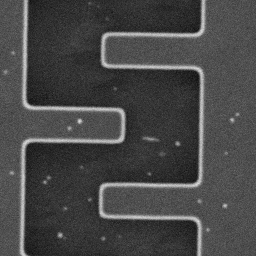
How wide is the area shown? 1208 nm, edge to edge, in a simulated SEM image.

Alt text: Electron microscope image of groups of lines, slits or small figures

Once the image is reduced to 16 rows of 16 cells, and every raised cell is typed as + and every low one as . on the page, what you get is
++...........+++
++...........+++
++....++++++++++
++....++++++++++
++..........++++
++...........+++
++...........+++
++++++++.....+++
++++++++.....+++
++...........+++
+...........++++
+...........++++
+.....++++++++++
+......+++++++++
+...........++++
+...........++++